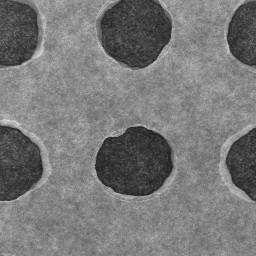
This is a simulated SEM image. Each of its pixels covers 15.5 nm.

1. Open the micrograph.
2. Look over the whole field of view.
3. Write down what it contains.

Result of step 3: holes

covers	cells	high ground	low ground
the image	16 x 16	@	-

--@@@@@---@@@@@-
---@@@-----@@@--
---@@@-----@@@--
--@@@@@---@@@@@-
@@@@@@@@@@@@@@@@
@@@@@@@@@@@@@@@@
@@@@@@@@@@@@@@@@
@@@@@@@@@@@@@@@@
--@@@@@---@@@@@-
---@@@-----@@@--
---@@@-----@@@--
--@@@@@---@@@@@-
-@@@@@@@@@@@@@@@
@@@@@@@@@@@@@@@@
@@@@@@@@@@@@@@@@
@@@@@@@@@@@@@@@@